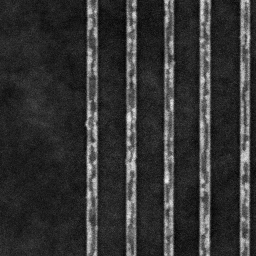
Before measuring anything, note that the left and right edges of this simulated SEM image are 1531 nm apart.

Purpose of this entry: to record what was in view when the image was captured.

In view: parallel lines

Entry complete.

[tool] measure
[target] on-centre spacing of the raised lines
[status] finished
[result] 228 nanometres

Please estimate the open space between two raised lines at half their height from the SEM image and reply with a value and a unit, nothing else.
182 nm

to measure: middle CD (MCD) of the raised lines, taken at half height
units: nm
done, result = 50.1